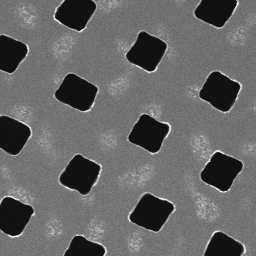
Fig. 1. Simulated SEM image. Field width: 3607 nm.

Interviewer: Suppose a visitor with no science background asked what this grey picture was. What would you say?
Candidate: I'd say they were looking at holes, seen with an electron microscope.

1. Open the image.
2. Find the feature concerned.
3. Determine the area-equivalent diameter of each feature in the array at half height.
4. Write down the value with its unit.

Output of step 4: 0.513 um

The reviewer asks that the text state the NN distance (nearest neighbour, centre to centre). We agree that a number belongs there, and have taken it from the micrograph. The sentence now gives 1130 nm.